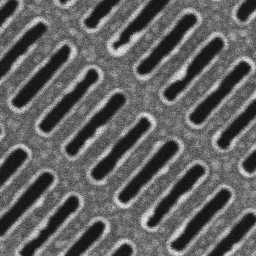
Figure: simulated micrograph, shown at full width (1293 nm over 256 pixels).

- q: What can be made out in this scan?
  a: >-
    a regular array of holes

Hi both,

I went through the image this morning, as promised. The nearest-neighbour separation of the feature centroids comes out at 0.179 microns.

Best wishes